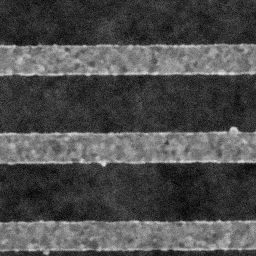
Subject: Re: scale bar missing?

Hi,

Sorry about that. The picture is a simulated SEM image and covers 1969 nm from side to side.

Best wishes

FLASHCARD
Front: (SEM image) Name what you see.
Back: lines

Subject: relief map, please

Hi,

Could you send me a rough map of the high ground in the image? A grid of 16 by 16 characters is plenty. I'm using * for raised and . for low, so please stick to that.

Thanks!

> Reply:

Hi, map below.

................
................
................
****************
****************
................
................
................
****************
****************
................
................
................
................
****************
****************